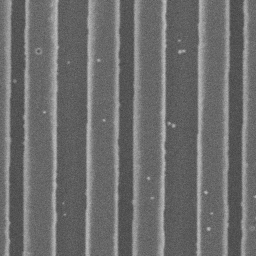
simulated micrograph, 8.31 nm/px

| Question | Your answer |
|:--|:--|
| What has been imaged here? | lines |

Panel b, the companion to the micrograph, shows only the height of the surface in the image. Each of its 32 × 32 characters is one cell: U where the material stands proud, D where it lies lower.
UDDUUUUDDDDUUUUDDUUUUDDDDUUUUDDU
UDDUUUUDDDDUUUUDDUUUUDDDDUUUDDDU
UDDUUUUDDDDUUUUDDUUUUDDDDUUUUDDU
UDDUUUUDDDDUUUUDDUUUUDDDDUUUUDDU
UDDUUUUDDDDUUUUDDUUUUDDDDUUUUDDU
UDDUUUUDDDDUUUUDDUUUUDDDDUUUUDDU
UDDUUUUDDDDUUUUDDUUUUDDDDUUUDDDU
UDDUUUUDDDDUUUUDDUUUDDDDDUUUDDDU
UDDUUUUDDDDUUUUDDUUUUDDDDUUUDDDU
UDDUUUUDDDDUUUUDDUUUUDDDDUUUDDDU
UDDUUUUDDDDUUUUDDUUUUDDDDUUUDDDU
UDDUUUUDDDDUUUUDDUUUUDDDDUUUDDDU
UDDUUUUDDDDUUUUDDUUUUDDDDUUUDDDU
UDDUUUUDDDDUUUUDDUUUDDDDDUUUDDDU
UDDUUUUDDDDUUUUDDUUUDDDDDUUUDDDU
UDDUUUUDDDDUUUUDDUUUDDDDDUUUDDUU
UDDUUUUDDDDUUUUDDUUUDDDDDUUUDDUU
UDDUUUUDDDDUUUUDDUUUDDDDDUUUDDUU
UDDUUUUDDDDUUUUDDUUUDDDDDUUUDDUU
UDDUUUUDDDDUUUUDDUUUDDDDDUUUDDUU
UDDUUUUDDDDUUUUDDUUUDDDDDUUUDDUU
UDDUUUUDDDDUUUUDDUUUDDDDDUUUDDUU
UDDUUUUDDDDUUUUDDUUUDDDDDUUUDDUU
UDDUUUUDDDDUUUUDDUUUDDDDDUUUDDUU
UDDUUUUDDDDUUUUDDUUUDDDDDUUUDDUU
UDDUUUUDDDDUUUUDDUUUDDDDDUUUDDUU
UDDUUUUDDDDUUUUDDUUUDDDDDUUUDDUU
UDDUUUUDDDDUUUUDDUUUDDDDDUUUDDUU
UDDUUUUDDDDUUUUDDUUUDDDDDUUUDDUU
UDDUUUUDDDDUUUUDDUUUDDDDDUUUDDUU
UDDUUUUDDDDUUUUDDUUUDDDDDUUUDDUU
UDDUUUUDDDDUUUUDDUUUDDDDDUUUDDUU